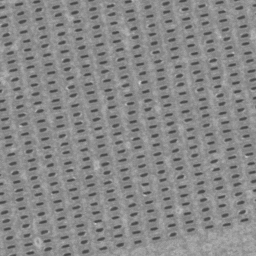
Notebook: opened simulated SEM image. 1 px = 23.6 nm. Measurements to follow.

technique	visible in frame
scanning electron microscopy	a regular array of holes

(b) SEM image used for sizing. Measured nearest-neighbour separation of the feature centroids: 207 nm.